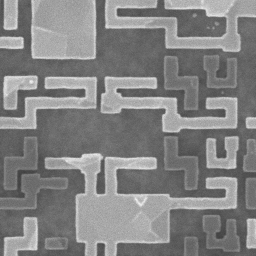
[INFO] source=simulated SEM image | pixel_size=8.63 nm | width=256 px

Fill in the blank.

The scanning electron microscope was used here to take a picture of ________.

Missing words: wiring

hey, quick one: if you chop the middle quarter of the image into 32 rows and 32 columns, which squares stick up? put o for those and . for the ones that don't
.........................ooo....
.........................ooo....
.........................ooo....
oooooooo..ooooooooooooo..ooooooo
oooooooo..ooooooooooooo..ooooooo
oooooooo...oooooooooooo..ooooooo
.....ooo...oo.................oo
.....ooo..oooo................oo
.oo..ooo.oooooo...............oo
oooooooo.ooooooooooooooooooo..oo
oooooooo.ooooooooooooooooooo..oo
.........ooooo...........ooo....
.........................oooo...
.........................ooooo..
.........................ooooooo
.........................ooooooo
.........................oooo...
................................
.........................ooo....
.........................ooo....
.........................ooo....
.........................ooo....
.........................ooo....
....ooooo................ooooooo
ooooooooo.ooooooooooooo..ooooooo
ooooooooo.ooooooooooooo..ooooooo
....ooooo.ooo.................oo
.....ooo..ooo.................oo
.....ooo..ooo.................oo
o....ooo...oo.................oo
o....ooo...oo.................oo
.....ooo...oo...................